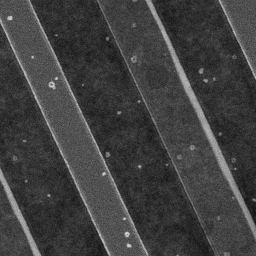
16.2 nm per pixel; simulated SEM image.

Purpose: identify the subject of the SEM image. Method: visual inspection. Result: lines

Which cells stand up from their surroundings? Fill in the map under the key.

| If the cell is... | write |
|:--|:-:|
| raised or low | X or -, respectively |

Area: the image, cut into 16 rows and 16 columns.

XX----XXXX----XX
XXX----XXX----XX
-XX----XXXX----X
-XX-----XXX----X
-XXX----XXX-----
--XX-----XXX----
--XXX----XXX----
---XX-----XXX---
---XXX----XXX---
----XX-----XXX--
----XXX----XXX--
-----XX----XXXX-
X----XXX----XXX-
X-----XX----XXXX
XX----XXX----XXX
XX-----XX----XXX